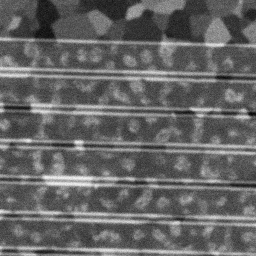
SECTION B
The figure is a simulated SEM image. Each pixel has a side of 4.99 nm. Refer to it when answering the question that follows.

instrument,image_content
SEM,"parallel lines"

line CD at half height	6.49	pixels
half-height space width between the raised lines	144	nanometres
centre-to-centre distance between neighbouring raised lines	179	nanometers